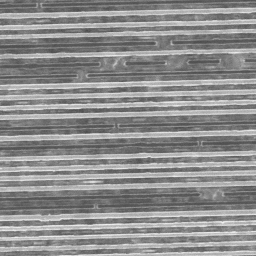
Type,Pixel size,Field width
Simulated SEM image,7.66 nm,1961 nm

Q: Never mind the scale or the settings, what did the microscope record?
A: parallel lines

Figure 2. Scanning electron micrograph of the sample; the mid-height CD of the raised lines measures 0.0335 um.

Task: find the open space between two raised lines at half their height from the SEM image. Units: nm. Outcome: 46.9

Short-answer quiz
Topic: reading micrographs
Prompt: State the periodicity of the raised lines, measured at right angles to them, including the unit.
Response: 77.6 nm